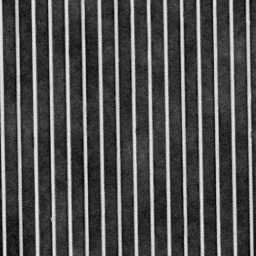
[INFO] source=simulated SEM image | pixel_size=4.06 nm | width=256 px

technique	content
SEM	parallel lines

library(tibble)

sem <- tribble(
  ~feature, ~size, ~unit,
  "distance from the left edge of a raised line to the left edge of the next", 66.9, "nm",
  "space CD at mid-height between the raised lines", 51.8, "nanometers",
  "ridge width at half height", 13.7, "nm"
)